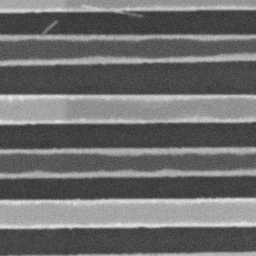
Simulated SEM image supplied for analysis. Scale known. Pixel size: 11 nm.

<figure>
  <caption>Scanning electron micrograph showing lines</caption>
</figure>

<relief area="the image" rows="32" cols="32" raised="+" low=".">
++++++++++++++++++++++++++++++++
+++++.........+.................
................................
................................
................................
++++++++++++++++++++++++++++++++
++++++++++++++++++++++++++++++++
++++++++++++++++++++++++++......
................................
................................
................................
................................
++++++++++++++++++++++++++++++++
++++++++++++++++++++++++++++++++
++++++++++++++++++++++++++++++++
++++............................
................................
................................
................................
++++++++++++++++++++++++++++++++
++++++++++++++++++++++++++++++++
++++++++++++++++++++++++++++++++
................................
................................
................................
++++++++++++++++++++++++++++++++
++++++++++++++++++++++++++++++++
++++++++++++++++++++++++++++++++
+++++...........................
................................
................................
................................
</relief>